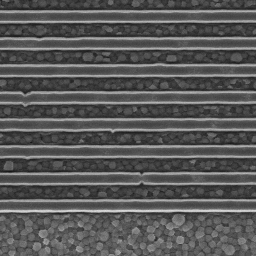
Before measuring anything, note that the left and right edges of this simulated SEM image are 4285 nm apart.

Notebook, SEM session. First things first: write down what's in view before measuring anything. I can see parallel lines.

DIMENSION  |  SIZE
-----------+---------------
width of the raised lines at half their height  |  0.18 µm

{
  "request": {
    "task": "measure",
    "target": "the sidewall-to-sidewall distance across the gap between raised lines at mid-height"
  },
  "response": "0.27 microns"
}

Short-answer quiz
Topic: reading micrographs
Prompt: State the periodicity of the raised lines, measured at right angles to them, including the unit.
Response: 453 nanometers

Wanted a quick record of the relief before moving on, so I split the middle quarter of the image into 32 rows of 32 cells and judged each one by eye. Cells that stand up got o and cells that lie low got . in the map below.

oooooooooooooooooooooooooooooooo
oooooooooooooooooooooooooooooooo
oooooooooooooooooooooooooooooooo
................................
................................
................................
................................
oooooooooooooooooooooooooooooooo
oooooooooooooooooooooooooooooooo
oooooooooooooooooooooooooooooooo
................................
................................
................................
................................
oooooooooooooooooooooooooooooooo
oooooooooooooooooooooooooooooooo
ooooo.......o.......ooooo.......
................................
................................
................................
....oo..........................
oooooooooooooooooooooooooooooooo
oooooooooooooooooooooooooooooooo
................................
................................
................................
................................
ooooooooooooooooooo.oooooooooooo
oooooooooooooooooooooooooooooooo
oooooooooooooooooooooooooooooooo
................................
................................